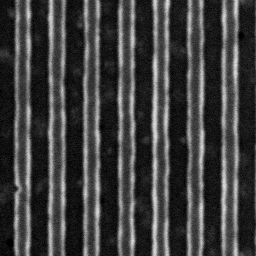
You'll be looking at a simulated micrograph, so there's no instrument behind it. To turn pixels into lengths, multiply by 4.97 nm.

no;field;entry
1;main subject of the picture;parallel lines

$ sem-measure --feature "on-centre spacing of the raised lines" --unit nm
172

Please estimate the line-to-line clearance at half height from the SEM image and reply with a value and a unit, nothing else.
0.106 µm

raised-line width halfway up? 64.6 nm